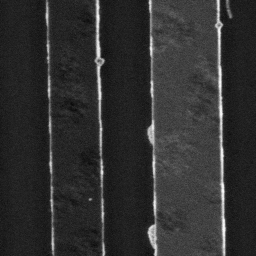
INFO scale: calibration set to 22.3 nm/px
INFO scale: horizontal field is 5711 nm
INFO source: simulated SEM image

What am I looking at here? lines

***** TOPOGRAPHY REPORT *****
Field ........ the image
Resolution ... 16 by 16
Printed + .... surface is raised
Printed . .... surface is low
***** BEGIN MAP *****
...+++...+++++..
...+++...+++++..
...+++...+++++..
...+++...+++++..
...+++...+++++..
...+++...+++++..
...+++....++++..
...+++....++++..
...+++....++++..
...+++....++++..
...+++....++++..
...+++....++++..
...+++....++++..
...+++....++++..
...+++....++++..
...+++....++++..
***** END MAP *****